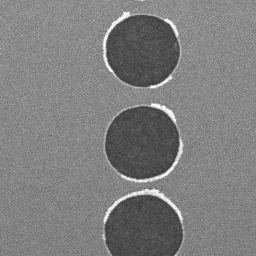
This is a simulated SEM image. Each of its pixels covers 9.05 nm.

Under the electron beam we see holes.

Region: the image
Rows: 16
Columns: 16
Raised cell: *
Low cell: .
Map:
****************
*******...******
*******....*****
*******....*****
*******....*****
****************
****************
*******....*****
*******....*****
*******....*****
*******....*****
****************
********..******
*******....*****
*******....*****
*******....*****